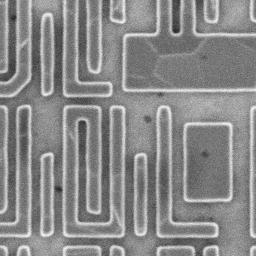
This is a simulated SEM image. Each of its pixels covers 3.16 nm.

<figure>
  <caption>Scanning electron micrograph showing wiring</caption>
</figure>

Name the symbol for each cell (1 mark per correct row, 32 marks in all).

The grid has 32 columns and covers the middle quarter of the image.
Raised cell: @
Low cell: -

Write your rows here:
@@@---@@@------@@@@@@@@@@@@@@@@@
@@@---@@@------@@@@@@@@@@@@@@@@@
@@@------------@@@@@@@@@@@@@@@@@
@@@------------@@@@@@@@@@@@@@@@@
@@@@-----------@@@@@@@@@@@@@@@@@
@@@@@@@@@@@@---@@@@@@@@@@@@@@@@@
@@@@@@@@@@@@---@@@@@@@@@@@@@@@@@
@@@@@@@@@@@@--------------------
--------------------------------
--------------------------------
--------------------------------
@@@@@@@@@---@@@---------@@------
@@@@@@@@@---@@@--------@@@------
@@@@@@@@@---@@@--------@@@@-----
@@@---@@@---@@@--------@@@@-----
@@@---@@@---@@@--------@@@@---@@
@@@---@@@---@@@--------@@@@---@@
@@@---@@@---@@@---------@@@---@@
@@@---@@@---@@@---------@@@---@@
@@@---@@@---@@@---------@@@---@@
@@@---@@@---@@@---------@@@---@@
@@@---@@@---@@@---------@@@---@@
@@@---@@@---@@@----@----@@@---@@
@@@---@@@---@@@---@@@--@@@@---@@
@@@---@@@---@@@---@@@--@@@@---@@
@@@---@@@---@@@---@@@--@@@@---@@
@@@---@@@---@@@---@@@--@@@@---@@
@@@---@@@---@@@---@@@--@@@@---@@
@@@---@@@---@@@---@@@--@@@@---@@
@@@---@@@---@@@---@@@--@@@@---@@
@@@---@@@---@@@---@@@--@@@@---@@
@@@---@@@---@@@---@@@--@@@@---@@